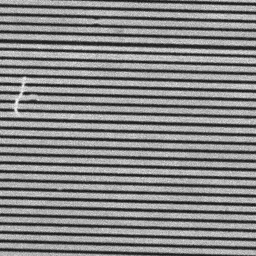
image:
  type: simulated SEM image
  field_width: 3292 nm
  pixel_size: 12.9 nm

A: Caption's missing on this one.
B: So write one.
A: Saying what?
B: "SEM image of parallel lines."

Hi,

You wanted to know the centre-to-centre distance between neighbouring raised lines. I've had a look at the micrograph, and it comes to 112 nm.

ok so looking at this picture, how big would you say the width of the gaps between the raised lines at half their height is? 2.88 px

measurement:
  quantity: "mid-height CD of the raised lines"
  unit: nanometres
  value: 72.3